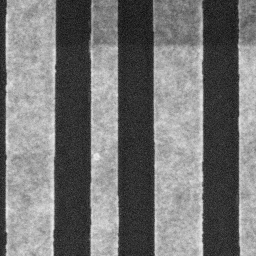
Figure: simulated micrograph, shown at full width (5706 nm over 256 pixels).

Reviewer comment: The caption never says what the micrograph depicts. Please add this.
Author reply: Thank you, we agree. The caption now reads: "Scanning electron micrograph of lines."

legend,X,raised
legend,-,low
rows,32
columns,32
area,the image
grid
-XXXXXX----XXXX----XXXXXX-----XX
-XXXXXX----XXXX----XXXXXX-----XX
-XXXXXX----XXXX----XXXXXX-----XX
-XXXXXX----XXXX----XXXXXX-----XX
-XXXXXX----XXXX----XXXXXX-----XX
-XXXXXX----XXXX----XXXXXX-----XX
-XXXXXX----XXXX----XXXXXX-----XX
-XXXXXX----XXXX----XXXXXX-----XX
-XXXXXX----XXXX----XXXXXX-----XX
-XXXXXX----XXXX----XXXXXX-----XX
-XXXXXX----XXXX----XXXXXX-----XX
-XXXXXX----XXXX----XXXXXX-----XX
-XXXXXX----XXXX----XXXXXX-----XX
-XXXXXX----XXXX----XXXXXX-----XX
-XXXXXX----XXXX----XXXXXX-----XX
-XXXXXX----XXXX----XXXXXX-----XX
-XXXXXX----XXXX----XXXXXX-----XX
-XXXXXX----XXXX----XXXXXX-----XX
-XXXXXX----XXXX----XXXXXX-----XX
-XXXXXX----XXXX----XXXXXX-----XX
-XXXXXX----XXXX----XXXXXX-----XX
-XXXXXX----XXXX----XXXXXX-----XX
-XXXXXX----XXXX----XXXXXX-----XX
-XXXXXX----XXXX----XXXXXX-----XX
-XXXXXX----XXXX----XXXXXX-----XX
-XXXXXX----XXXX----XXXXXX-----XX
-XXXXXX----XXXX----XXXXXX-----XX
-XXXXXX----XXXX----XXXXXX-----XX
-XXXXXX----XXXX----XXXXXX-----XX
-XXXXXX----XXXX----XXXXXX-----XX
-XXXXXX----XXXX----XXXXXX-----XX
-XXXXXX----XXXX----XXXXXX-----XX